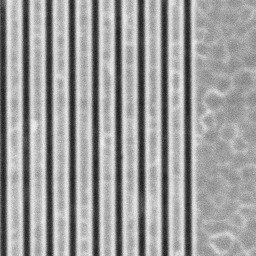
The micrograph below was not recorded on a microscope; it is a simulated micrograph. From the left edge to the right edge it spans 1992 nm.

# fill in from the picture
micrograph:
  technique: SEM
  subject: parallel lines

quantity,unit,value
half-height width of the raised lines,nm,110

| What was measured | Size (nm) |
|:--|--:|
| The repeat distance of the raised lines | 179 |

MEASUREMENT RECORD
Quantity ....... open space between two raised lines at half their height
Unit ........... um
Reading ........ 0.0661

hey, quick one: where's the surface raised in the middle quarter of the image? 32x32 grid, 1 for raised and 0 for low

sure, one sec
10011110011100011100111100111100
10011110011110011100111100111100
10011110011110011100111100111100
10011110011110011100111100111100
10011110011110011100111100111100
10011110011110011100111100111100
10011110011110011100011100111100
10011110011110011100011100111100
10011110011110011100011100111100
10011110011110011100011100111100
10011110011110011100011100111100
10011110011110011100011100111100
10011110011110011100011100111100
10011110011110011100011100111100
10011110011110011100011100111100
10011110011110011100011100111100
10011110011110011100011100111100
10011110011110011100011100111100
10011110011110011100011100111100
10011110011110011100011100111100
10011110011110011100011100111100
10011110011110011100011100111100
10011110011110011100011100111100
10011110011110011100011100111100
10011110011110011100011100111100
10011110011110011100011100111100
10011110011110011100011100111100
10011110011110011100011100111100
10011110011110011100011100111100
10011110011110011100011100111100
10011110011110011100011100111100
10011110011110011100011100111100